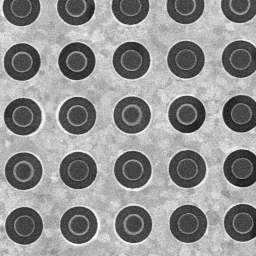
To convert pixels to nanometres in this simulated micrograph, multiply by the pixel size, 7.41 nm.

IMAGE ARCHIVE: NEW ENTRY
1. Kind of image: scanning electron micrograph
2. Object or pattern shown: an array of small figures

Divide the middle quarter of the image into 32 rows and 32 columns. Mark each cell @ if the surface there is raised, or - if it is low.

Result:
-@@@@---@@@@---@@@@---@@@@---@@@
--@@----@@@@@--------@@@@@------
-------@@@@@@-------@@@@@@@-----
@----@@@@@@@@@@----@@@@@@@@@@---
@@@@@@@@@@@@@@@@@@@@@@@@@@@@@@@@
@@@@@@@@@@@@@@@@@@@@@@@@@@@@@@@@
@@@@@@@@@@@@@@@@@@@@@@@@@@@@@@@@
@@@@@@@@@@@@@@@@@@@@@@@@@@@@@@@@
@----@@@@@@@@@@----@@@@@@@@@----
-------@@@@@@@-------@@@@@@-----
-------@@@@@@--------@@@@@----@-
-@@@@---@@@@---@@@@---@@@@---@@@
-@@@@@--@@@@---@@@@---@@@@---@@@
-@@@@@--@@@@---@@@@---@@@@---@@@
--@@@---@@@@@---@@----@@@@---@@@
--------@@@@@--------@@@@@@-----
------@@@@@@@@------@@@@@@@@----
@@---@@@@@@@@@@@--@@@@@@@@@@@@-@
@@@@@@@@@@@@@@@@@@@@@@@@@@@@@@@@
@@@@@@@@@@@@@@@@@@@@@@@@@@@@@@@@
@@@@@@@@@@@@@@@@@@@@@@@@@@@@@@@@
@@@@@@@@@@@@@@@@@-@@@@@@@@@@@@-@
@-----@@@@@@@@------@@@@@@@@----
-------@@@@@@--------@@@@@@-----
--@@@---@@@@@---@@----@@@@---@@@
-@@@@@--@@@@@--@@@@---@@@@--@@@@
-@@@@@--@@@@---@@@@@--@@@@--@@@@
-@@@@@--@@@@@--@@@@---@@@@---@@@
--@@@---@@@@@---@@----@@@@@---@@
-------@@@@@@@-------@@@@@@-----
@------@@@@@@@@-----@@@@@@@@@---
@@@@@@@@@@@@@@@@@-@@@@@@@@@@@@@@